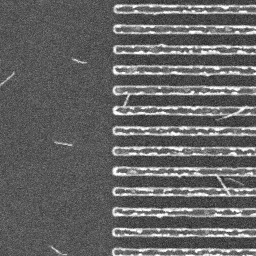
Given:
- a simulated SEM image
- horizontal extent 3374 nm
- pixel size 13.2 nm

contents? parallel lines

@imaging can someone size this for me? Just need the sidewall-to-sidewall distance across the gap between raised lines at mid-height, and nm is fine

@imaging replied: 165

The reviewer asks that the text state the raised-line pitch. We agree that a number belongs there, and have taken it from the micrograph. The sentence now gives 268 nanometers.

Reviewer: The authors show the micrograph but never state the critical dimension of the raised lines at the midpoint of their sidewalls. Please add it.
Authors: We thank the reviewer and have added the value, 102 nm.